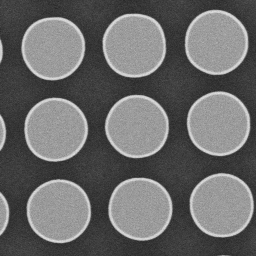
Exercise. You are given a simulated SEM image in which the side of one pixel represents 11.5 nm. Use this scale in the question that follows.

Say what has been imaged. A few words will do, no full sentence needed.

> an array of small figures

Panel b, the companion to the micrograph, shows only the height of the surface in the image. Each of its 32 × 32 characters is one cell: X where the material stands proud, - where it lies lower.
--------------------------------
--------------------------XX----
-----XXX------XXXXX-----XXXXXX--
----XXXXXX----XXXXXX----XXXXXXX-
---XXXXXXX---XXXXXXXX--XXXXXXXX-
---XXXXXXXX--XXXXXXXX--XXXXXXXX-
---XXXXXXXX--XXXXXXXX--XXXXXXXX-
---XXXXXXX---XXXXXXX----XXXXXX--
----XXXXXX----XXXXXX-----XXXX---
-----XXX--------XX--------------
--------------------------------
---------------------------X----
------XX-------XXXX------XXXXX--
----XXXXXX----XXXXXX----XXXXXXX-
---XXXXXXXX--XXXXXXXX---XXXXXXX-
X--XXXXXXXX--XXXXXXXX--XXXXXXXX-
X--XXXXXXXX--XXXXXXXX---XXXXXXX-
X--XXXXXXXX---XXXXXXX---XXXXXXX-
----XXXXXX----XXXXXX-----XXXXX--
-----XXXX-------XXX-------------
--------------------------------
--------------------------------
----------------XXX------XXXXX--
-----XXXXX----XXXXXXX---XXXXXXX-
----XXXXXXX---XXXXXXX---XXXXXXXX
X--XXXXXXXX---XXXXXXX---XXXXXXXX
X--XXXXXXXX---XXXXXXX---XXXXXXXX
X---XXXXXXX---XXXXXXX---XXXXXXX-
X---XXXXXXX---XXXXXXX----XXXXXX-
-----XXXXX------XXXX-------XX---
--------------------------------
--------------------------------